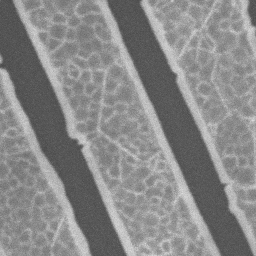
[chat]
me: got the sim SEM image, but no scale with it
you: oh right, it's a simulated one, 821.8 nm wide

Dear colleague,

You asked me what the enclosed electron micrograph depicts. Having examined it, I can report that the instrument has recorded one or a few lines or trenches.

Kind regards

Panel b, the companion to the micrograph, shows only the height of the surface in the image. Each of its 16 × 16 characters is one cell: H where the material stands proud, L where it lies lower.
LHHHHHHLLHHHHHHL
LLHHHHHLLLHHHHHH
LLHHHHHLLLHHHHHH
LLLHHHHHLLLHHHHH
LLLHHHHHLLLHHHHH
HLLLHHHHHLLLHHHH
HLLLHHHHHLLLHHHH
HHLLHHHHHHLLHHHH
HHLLLHHHHHLLLHHH
HHLLLHHHHHLLLHHH
HHHLLLHHHHHLLLHH
HHHHLLHHHHHLLLHH
HHHHLLLHHHHHLLHH
HHHHLLLHHHHHLLLH
HHHHHLLLHHHHHLLH
HHHHHLLLHHHHHLLL